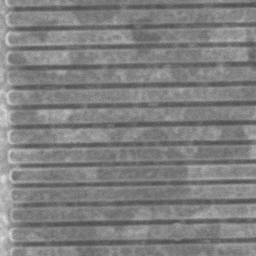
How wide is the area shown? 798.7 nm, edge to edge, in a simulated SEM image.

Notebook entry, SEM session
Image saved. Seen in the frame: parallel lines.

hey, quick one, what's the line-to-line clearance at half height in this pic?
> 18.3 nm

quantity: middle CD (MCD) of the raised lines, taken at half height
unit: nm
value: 41.7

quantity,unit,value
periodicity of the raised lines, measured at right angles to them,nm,61.1